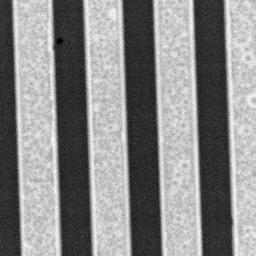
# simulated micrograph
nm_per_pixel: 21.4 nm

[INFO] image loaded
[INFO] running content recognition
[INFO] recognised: one or a few lines or trenches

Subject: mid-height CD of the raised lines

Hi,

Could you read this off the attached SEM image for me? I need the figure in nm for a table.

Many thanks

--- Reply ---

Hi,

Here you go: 706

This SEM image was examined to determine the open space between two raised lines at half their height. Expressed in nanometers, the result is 810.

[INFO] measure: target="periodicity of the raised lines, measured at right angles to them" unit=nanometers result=1510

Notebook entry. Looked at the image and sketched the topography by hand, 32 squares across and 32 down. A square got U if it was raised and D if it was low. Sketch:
DDUUUUDDDDDUUUUDDDDDUUUUDDDDDUUU
DDUUUUDDDDDUUUUDDDDDUUUUDDDDDUUU
DDUUUUDDDDDUUUUDDDDDUUUUDDDDDUUU
DDUUUUDDDDDUUUUDDDDDUUUUDDDDDUUU
DDUUUUDDDDDUUUUDDDDDUUUUDDDDDUUU
DDUUUUDDDDDUUUUDDDDDUUUUDDDDDUUU
DDUUUUDDDDDUUUUDDDDDUUUUDDDDDUUU
DDUUUUDDDDDUUUUDDDDDUUUUDDDDDUUU
DDUUUUDDDDDUUUUDDDDDUUUUDDDDDUUU
DDUUUUDDDDDUUUUDDDDDUUUUDDDDDUUU
DDUUUUDDDDDUUUUDDDDDUUUUDDDDDUUU
DDUUUUDDDDDUUUUDDDDDUUUUDDDDDUUU
DDUUUUUDDDDUUUUDDDDDUUUUDDDDDUUU
DDDUUUUDDDDUUUUDDDDDUUUUDDDDDUUU
DDUUUUUDDDDUUUUDDDDDUUUUDDDDDUUU
DDDUUUUDDDDUUUUDDDDDUUUUDDDDDUUU
DDDUUUUDDDDUUUUDDDDDUUUUDDDDDUUU
DDDUUUUDDDDDUUUDDDDDUUUUDDDDDUUU
DDDUUUUDDDDDUUUDDDDDUUUUDDDDDUUU
DDDUUUUDDDDDUUUDDDDDUUUUDDDDDUUU
DDDUUUUDDDDDUUUUDDDDUUUUDDDDDUUU
DDDUUUUDDDDDUUUUDDDDUUUUDDDDDUUU
DDDUUUUDDDDDUUUUDDDDUUUUDDDDDUUU
DDDUUUUDDDDDUUUUDDDDUUUUUDDDDUUU
DDDUUUUDDDDDUUUUDDDDUUUUUDDDDUUU
DDDUUUUDDDDDUUUUDDDDDUUUUDDDDUUU
DDDUUUUDDDDDUUUUDDDDDUUUUDDDDDUU
DDDUUUUDDDDDUUUUDDDDDUUUUDDDDDUU
DDDUUUUDDDDDUUUUDDDDDUUUUDDDDDUU
DDDUUUUDDDDDUUUUDDDDDUUUUDDDDDUU
DDDUUUUDDDDDUUUUDDDDDUUUUDDDDDUU
DDDUUUUDDDDDUUUUDDDDDUUUUDDDDDUU